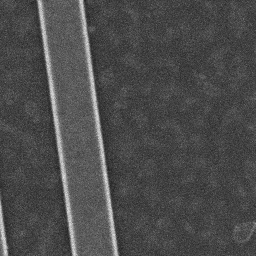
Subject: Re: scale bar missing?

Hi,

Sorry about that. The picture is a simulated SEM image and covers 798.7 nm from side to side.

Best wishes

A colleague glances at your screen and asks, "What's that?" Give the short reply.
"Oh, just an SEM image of one or a few lines or trenches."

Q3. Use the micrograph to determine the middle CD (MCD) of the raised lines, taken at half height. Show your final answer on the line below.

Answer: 42.9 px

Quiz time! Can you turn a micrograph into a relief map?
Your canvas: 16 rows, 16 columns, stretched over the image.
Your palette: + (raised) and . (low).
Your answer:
...++...........
...++...........
...++...........
...+++..........
...+++..........
...+++..........
...+++..........
...+++..........
....++..........
....++..........
....+++.........
....+++.........
....+++.........
....+++.........
....+++.........
.....++.........